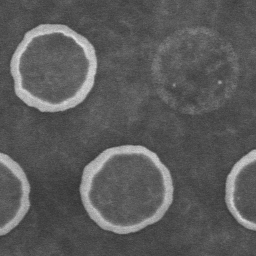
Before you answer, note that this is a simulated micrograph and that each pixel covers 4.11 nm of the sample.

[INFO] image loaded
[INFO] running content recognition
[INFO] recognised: raised bodies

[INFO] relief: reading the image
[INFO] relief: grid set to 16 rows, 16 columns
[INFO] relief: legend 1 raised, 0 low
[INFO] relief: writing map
0000000000000000
0000000000000000
0011100000000000
0111110000000000
0111110000000000
0111100000000000
0011000000000000
0000000000000000
0000000000000000
0000000110000000
1000001111000001
1100011111100011
1100011111000011
1000001111000001
0000000000000000
0000000000000000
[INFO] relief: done